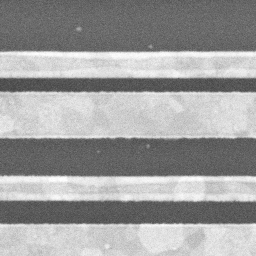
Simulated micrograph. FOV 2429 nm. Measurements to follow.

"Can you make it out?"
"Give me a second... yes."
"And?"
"lines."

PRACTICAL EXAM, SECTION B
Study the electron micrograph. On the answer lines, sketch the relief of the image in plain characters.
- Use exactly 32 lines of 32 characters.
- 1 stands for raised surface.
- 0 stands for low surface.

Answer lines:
00000000000000000000000000000000
00000000000000000000000000000000
00000000000000000000000000000000
00000000000000000000000000000000
00000000000000000000000000000000
00000000000000000000000000000000
00000000000000000000000000000000
11111111111111111111111111111111
11111111111111111111111111111111
00000000000000000000000000000000
00000000000000000000000000000000
00000000000000000000000000000000
11111111111111111111111111111111
11111111111111111111111111111111
11111111111111111111111111111111
11111111111111111111111111111111
11111111111111111111111111111111
00000000000000000000000000000000
00000000000000000000000000000000
00000000000000000000000000000000
00000000000000000000000000000000
00000000000000000000000000000000
11111111110000000111111111111111
11111111111111111111111111111111
11111111111111111111111111111111
00000000000000000000000000000000
00000000000000000000000000000000
00000000000000000000000000000000
11111111111111111111111111111111
11111111111111111111111111111111
11111111111111111111111111111111
11111111111111111111111111111111